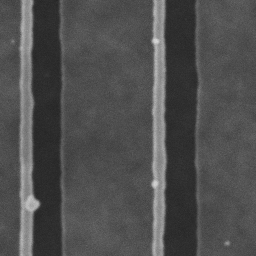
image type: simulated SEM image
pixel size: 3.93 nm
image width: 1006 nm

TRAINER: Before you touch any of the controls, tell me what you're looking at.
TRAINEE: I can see lines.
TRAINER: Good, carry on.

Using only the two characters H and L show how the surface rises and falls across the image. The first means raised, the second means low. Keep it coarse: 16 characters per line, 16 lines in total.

HHLLHHHHHHLLHHHH
HHLLHHHHHHLLHHHH
HHLLHHHHHHLLHHHH
HHLLHHHHHHLLHHHH
HHLLHHHHHHLLHHHH
HHLLHHHHHHLLHHHH
HHLLHHHHHHLLHHHH
HHLLHHHHHHLLHHHH
HHLLHHHHHHLLHHHH
HHLLHHHHHHLLHHHH
HHLLHHHHHHLLHHHH
HHLLHHHHHHLLHHHH
HHLLHHHHHHLLHHHH
HHLLHHHHHHLLHHHH
HHLLHHHHHHLLHHHH
HHLLHHHHHHLLHHHH